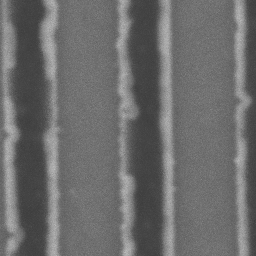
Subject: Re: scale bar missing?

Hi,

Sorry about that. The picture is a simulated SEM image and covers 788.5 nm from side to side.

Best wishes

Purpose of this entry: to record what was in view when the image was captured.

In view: one or a few lines or trenches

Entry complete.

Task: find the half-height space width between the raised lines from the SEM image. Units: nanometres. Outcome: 202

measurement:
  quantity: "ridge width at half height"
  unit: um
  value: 0.157